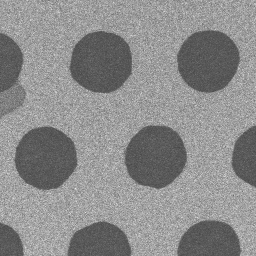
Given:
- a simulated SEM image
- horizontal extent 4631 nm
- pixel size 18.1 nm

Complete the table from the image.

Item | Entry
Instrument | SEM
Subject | holes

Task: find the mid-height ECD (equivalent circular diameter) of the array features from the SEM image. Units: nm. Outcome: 1130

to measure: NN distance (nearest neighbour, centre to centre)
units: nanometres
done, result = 1950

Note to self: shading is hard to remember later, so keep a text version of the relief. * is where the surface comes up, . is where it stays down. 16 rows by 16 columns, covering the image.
****************
****************
.****...****..**
.***....***....*
.***....***....*
.****..*****..**
.***************
****************
**..****...****.
*....***....***.
*....***...****.
**..*****..*****
****************
****************
.****...****...*
.***....***....*